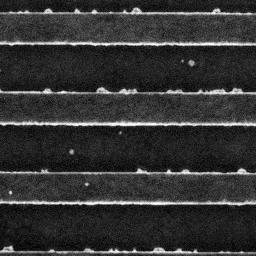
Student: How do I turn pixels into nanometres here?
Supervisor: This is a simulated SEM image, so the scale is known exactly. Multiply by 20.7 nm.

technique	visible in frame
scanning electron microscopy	lines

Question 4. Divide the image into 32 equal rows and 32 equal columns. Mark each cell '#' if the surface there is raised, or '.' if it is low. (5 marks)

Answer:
................................
................................
################################
################################
################################
...........##########.##########
................................
................................
................................
................................
................................
................................
################################
################################
################################
..##.###########################
................................
................................
................................
................................
................................
................................
################################
################################
################################
.............................#..
................................
................................
................................
................................
................................
##..............................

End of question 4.